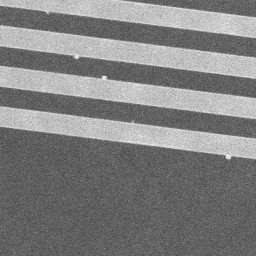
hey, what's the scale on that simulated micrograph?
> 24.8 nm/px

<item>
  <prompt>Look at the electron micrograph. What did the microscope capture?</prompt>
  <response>parallel lines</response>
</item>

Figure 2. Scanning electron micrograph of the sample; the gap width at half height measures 504 nm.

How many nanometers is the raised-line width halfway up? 483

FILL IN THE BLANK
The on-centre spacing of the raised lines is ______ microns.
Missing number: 0.992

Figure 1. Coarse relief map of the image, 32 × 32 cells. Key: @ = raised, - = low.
@@@@@@@@@@@@@@@@@@--------------
-------@@@@@@@@@@@@@@@@@@@------
--------------@@@@@@@@@@@@@@@@@@
@@--------------------@@@@@@@@@@
@@@@@@@@@@--------------------@@
@@@@@@@@@@@@@@@@@@--------------
------@@@@@@@@@@@@@@@@@@@@------
--------------@@@@@@@@@@@@@@@@@@
@@--------------------@@@@@@@@@@
@@@@@@@@@---------------------@@
@@@@@@@@@@@@@@@@@---------------
------@@@@@@@@@@@@@@@@@@@-------
--------------@@@@@@@@@@@@@@@@@@
@---------------------@@@@@@@@@@
@@@@@@@@@---------------------@@
@@@@@@@@@@@@@@@@@---------------
------@@@@@@@@@@@@@@@@@@@-------
--------------@@@@@@@@@@@@@@@@@@
----------------------@@@@@@@@@@
----------------------------@-@@
--------------------------------
--------------------------------
--------------------------------
--------------------------------
--------------------------------
--------------------------------
--------------------------------
--------------------------------
--------------------------------
--------------------------------
--------------------------------
--------------------------------